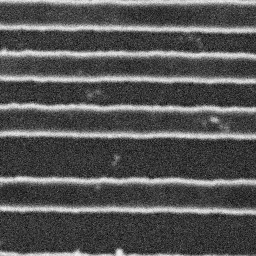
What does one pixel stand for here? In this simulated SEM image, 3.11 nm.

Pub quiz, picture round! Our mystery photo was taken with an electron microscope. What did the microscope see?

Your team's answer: lines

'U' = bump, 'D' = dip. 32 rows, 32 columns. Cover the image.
UUUUUUUUUUUUUUUUUUUUUUUUUUUUUUUU
UUUUUUUUUUUUUUUUUUUUUUUUUUUUUUUU
UUUUUUUUUUUUUUUUUUUUUUUUUUUUUUUU
UUUUUUUUUUUUUUUUUUUUUUUUUUUUUUUU
DDDDDDDDDDDDDDDDDDDDDDDDDDDDDDDD
DDDDDDDDDDDDDDDDDDDDDDDDDDDDDDDD
DDDUDDDDDDDDDDDDDDDDDDDDDDDDDDDD
UUUUUUUUUUUUUUUUUUUUUUUUUUUUUUUU
UUUUUUUUUUUUUUUUUUUUUUUUUUUUUUUU
UUUUUUUUUUUUUUUUUUUUUUUUUUUUUUUU
DDDDDDDDDDDDDDDDDDDDDDDDDDDDDDDD
DDDDDDDDDDDDDDDDDDDDDDDDDDDDDDDD
DDDDDDDDDDDDDDDDDDDDDDDDDDDDDDDD
UUUUUUUUUUUUUUUUUUUUUUUDUUUUDUDD
UUUUUUUUUUUUUUUUUUUUUUUUUUUUUUUU
UUUUUUUUUUUUUUUUUUUUUUUUUUUUUUUU
UUUUUUUUUUUUUUUUUUUUUUUUUUUUUUUU
DDDDDDDDDDDDDDDDDDDDDDDDDDDDDDDD
DDDDDDDDDDDDDDDDDDDDDDDDDDDDDDDD
DDDDDDDDDDDDDDDDDDDDDDDDDDDDDDDD
DDDDDDDDDDDDDDDDDDDDDDDDDDDDDDDD
DDDDDDDDDDDDDDDDDDDDDDDDDDDDDDDD
UUUUUUUUUUUUUUUUUUUUUUUUDDDDDDUD
UUUUUUUUUUUUUUUUUUUUUUUUUUUUUUUU
UUUUUUUUUUUUUUUUUUUUUUUUUUUUUUUU
UUUUUUUUUUUUUUUUUUUUUUUUUUUUUUUU
DDDDDDDDDDDDDDDDDDDDDDDDUUDUUUUU
DDDDDDDDDDDDDDDDDDDDDDDDDDDDDDDD
DDDDDDDDDDDDDDDDDDDDDDDDDDDDDDDD
DDDDDDDDDDDDDDDDDDDDDDDDDDDDDDDD
DDDDDDDDDDDDDDDDDDDDDDDDDDDDDDDD
DDDDDDDDDDDDDDDDDDDDDDDDDDDDDDDD